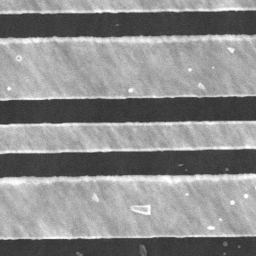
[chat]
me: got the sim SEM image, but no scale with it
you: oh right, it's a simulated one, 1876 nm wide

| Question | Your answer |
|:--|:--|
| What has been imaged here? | lines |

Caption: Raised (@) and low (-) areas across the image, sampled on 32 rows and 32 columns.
@@@@@@@@@@@@@@@@@@@@@@@@@@@@@@@@
@@@@@@@@@@@@@-@-----------------
--------------------------------
--------------------------------
------------------------@@@@@@@@
@@@@@@@@@@@@@@@@@@@@@@@@@@@@@@@@
@@@@@@@@@@@@@@@@@@@@@@@@@@@@@@@@
@@@@@@@@@@@@@@@@@@@@@@@@@@@@@@@@
@@@@@@@@@@@@@@@@@@@@@@@@@@@@@@@@
@@@@@@@@@@@@@@@@@@@@@@@@@@@@@@@@
@@@@@@@@@@@@@@@@@@@@@@@@@@@@@@@@
@@@@@@@@@@@@@@@@@@@@@@@@@@@@@@@@
@-------------------------------
--------------------------------
--------------------------------
-----@--@@@@@@@@@@@@@@@@@@@@@@@@
@@@@@@@@@@@@@@@@@@@@@@@@@@@@@@@@
@@@@@@@@@@@@@@@@@@@@@@@@@@@@@@@@
@@@@@@@@@@@@@@@@@@@@@@@@@@@@@@@@
--------------------------------
--------------------------------
--------------------------------
@@@@@@@@@@@@@@@@@@@@@@@@@@@@@@@@
@@@@@@@@@@@@@@@@@@@@@@@@@@@@@@@@
@@@@@@@@@@@@@@@@@@@@@@@@@@@@@@@@
@@@@@@@@@@@@@@@@@@@@@@@@@@@@@@@@
@@@@@@@@@@@@@@@@@@@@@@@@@@@@@@@@
@@@@@@@@@@@@@@@@@@@@@@@@@@@@@@@@
@@@@@@@@@@@@@@@@@@@@@@@@@@@@@@@@
@@@@@@@@@@@@@@@@@@@@@@@@@@@@@@@@
--------------------------------
--------------------------------